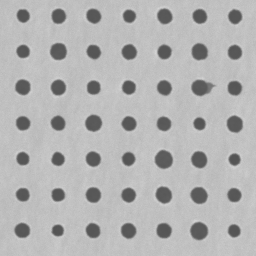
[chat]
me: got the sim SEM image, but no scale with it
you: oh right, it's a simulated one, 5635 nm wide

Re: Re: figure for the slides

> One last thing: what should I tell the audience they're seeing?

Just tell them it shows a regular array of holes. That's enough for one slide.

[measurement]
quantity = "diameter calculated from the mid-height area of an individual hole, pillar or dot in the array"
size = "334 nm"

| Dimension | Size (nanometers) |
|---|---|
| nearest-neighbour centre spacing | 774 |